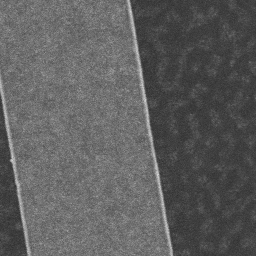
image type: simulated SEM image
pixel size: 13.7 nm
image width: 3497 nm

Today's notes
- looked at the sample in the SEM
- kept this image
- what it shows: one or a few lines or trenches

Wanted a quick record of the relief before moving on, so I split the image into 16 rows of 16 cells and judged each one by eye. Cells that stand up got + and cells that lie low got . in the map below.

++++++++........
++++++++........
++++++++........
+++++++++.......
+++++++++.......
+++++++++.......
+++++++++.......
+++++++++.......
.++++++++.......
.+++++++++......
.+++++++++......
.+++++++++......
.+++++++++......
.+++++++++......
..++++++++......
..+++++++++.....